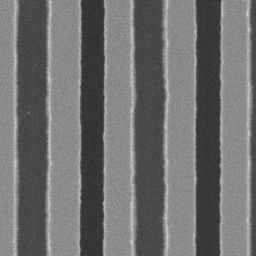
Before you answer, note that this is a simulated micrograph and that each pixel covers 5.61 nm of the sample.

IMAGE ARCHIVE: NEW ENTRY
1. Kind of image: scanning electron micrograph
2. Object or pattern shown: lines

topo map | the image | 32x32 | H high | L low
HHLLLLHHHHLLLHHHHLLLLHHHLLLLHHHL
HHLLLLHHHHLLLHHHHLLLLHHHLLLLHHHL
HHLLLLHHHHLLLHHHHLLLLHHHLLLLHHHL
HHLLLLHHHHLLLHHHHLLLLHHHHLLLHHHL
HHLLLLHHHHLLLHHHHLLLLHHHHLLLHHHL
HHLLLLHHHHLLLHHHHLLLLHHHLLLLHHHL
HHLLLLHHHHLLLHHHHLLLLHHHLLLLHHHL
HHLLLLHHHHLLLHHHHLLLLHHHHLLLHHHL
HHLLLLHHHHLLLHHHHLLLLHHHHLLLHHHL
HHLLLLHHHHLLLHHHHLLLLHHHLLLLHHHL
HHLLLLHHHHLLLHHHHLLLLHHHHLLLHHHL
HHLLLLHHHHLLLHHHHLLLLHHHLLLLHHHL
HHLLLLHHHHLLLHHHHLLLLHHHLLLLHHHL
HHLLLLHHHHLLLHHHHLLLLHHHHLLLHHHL
HHLLLLHHHHLLLHHHHLLLLHHHLLLLHHHL
HHLLLLHHHHLLLHHHHLLLLHHHLLLLHHHL
HHLLLLHHHHLLLHHHHLLLLHHHLLLLHHHL
HHLLLLHHHHLLLHHHHLLLLHHHLLLLHHHL
HHLLLLHHHHLLLHHHHLLLLHHHLLLLHHHL
HHLLLLHHHHLLLHHHHLLLLHHHLLLLHHHL
HHLLLLHHHHLLLHHHHLLLLHHHLLLLHHHL
HHLLLLHHHHLLLHHHHLLLLHHHLLLLHHHL
HHLLLLHHHHLLLHHHHLLLLHHHHLLLHHHL
HHLLLLHHHHLLLHHHHLLLLHHHLLLLHHHL
HHLLLLHHHHLLLHHHHLLLLHHHLLLLHHHL
HHLLLLHHHHLLLHHHHLLLLHHHLLLLHHHL
HHLLLLHHHHLLLHHHHLLLLHHHLLLLHHHL
HHLLLLHHHHLLLHHHHLLLLHHHLLLLHHHL
HHLLLLHHHHLLLHHHHLLLLHHHLLLLHHHL
HHLLLLHHHHLLLHHHHLLLLHHHLLLLHHHL
HHLLLLHHHHLLLHHHHLLLLHHHLLLLHHHL
HHLLLLHHHHLLLHHHHLLLLHHHLLLLHHHL